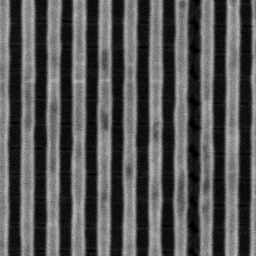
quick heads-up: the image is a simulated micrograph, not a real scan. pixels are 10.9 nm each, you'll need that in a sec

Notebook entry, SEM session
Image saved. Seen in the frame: wiring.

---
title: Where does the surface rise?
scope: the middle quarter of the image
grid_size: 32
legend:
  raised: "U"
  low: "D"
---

DDUUUDDDDUUUDDDUUUDDDDUUDDDDUUUD
DDUUUDDDDUUDDDDUUUDDDDUUDDDDUUUD
DDUUUDDDDUUDDDDUUUDDDDUUDDDDUUUD
DDUUUDDDDUUDDDDUUUDDDDUUDDDDUUUD
DDUUUDDDDUUDDDDUUUDDDDUUDDDDUUUD
DDUUUDDDDUUUDDDUUUDDDDUUDDDDUUUD
DDUUUDDDDUUUDDDUUUDDDDUUDDDDUUUD
DDUUUDDDDUUUDDDUUUDDDDUUDDDDUUUD
DDUUUDDDDUUUDDDUUUDDDDUUDDDDUUDD
DDUUUDDDDUUUDDDUUUDDDDUUDDDDUUUD
DDUUUDDDDUUUDDDUUUDDDDUUDDDDUUUD
DDUUUDDDDUUUDDDUUUDDDDUUDDDDUUUD
DDUUUDDDDUUUDDDUUUDDDDUUDDDDUUUD
DDUUUDDDDUUUDDDUUUDDDDUUDDDDUUUD
DDUUUDDDDUUUDDDUUUDDDDUUDDDDUUUD
DDUUUDDDDUUDDDDUUUDDDDUUDDDDUUUD
DDUUUDDDDUUDDDDUUUDDDDUUDDDDUUUD
DDUUUDDDDUUDDDDUUUDDDDUUDDDDUUUD
DDUUUDDDDUUDDDDUUUDDDDUUDDDDUUUD
DDUUUDDDDUUDDDDUUUDDDDUUDDDDUUUD
DDUUUDDDDUUDDDDUUUDDDDUUDDDDUUUD
DDUUUDDDDUUDDDDUUUDDDUUUDDDDUUDD
DDUUUDDDDUUDDDDUUUDDDUUUDDDDUUUD
DDUUUDDDDUUDDDDUUUDDDDUUDDDDUUUD
DDUUUDDDDUUDDDDUUUDDDDUUDDDDUUUD
DDUUUDDDDUUDDDDUUUDDDDUUDDDDUUUD
DDUUUDDDDUUDDDDUUUDDDDUUDDDDUUUD
DDUUUDDDDUUDDDDUUUDDDDUUDDDDUUUD
DDUUUDDDDUUDDDDUUUDDDDUUDDDDUUUD
DDUUUDDDDUUDDDDUUUDDDDUUDDDDUUUD
DDUUUDDDDUUDDDDUUUDDDDUUDDDDUUUD
DDUUUDDDDUUDDDDUUUDDDUUUDDDDUUUD